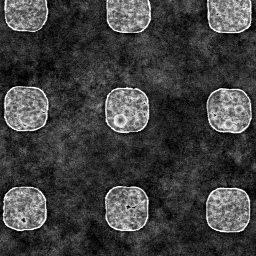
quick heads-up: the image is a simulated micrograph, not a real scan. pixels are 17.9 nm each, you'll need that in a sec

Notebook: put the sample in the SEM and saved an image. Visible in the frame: raised bodies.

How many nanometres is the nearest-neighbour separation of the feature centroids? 1780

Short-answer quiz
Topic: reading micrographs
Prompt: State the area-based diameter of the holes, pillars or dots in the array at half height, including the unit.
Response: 45.4 px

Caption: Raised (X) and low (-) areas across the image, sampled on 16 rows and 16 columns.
XXX----XX----XXX
-XX----XX----XX-
----------------
----------------
----------------
-X--------------
XXX----XX----XXX
XXX----XX----XXX
----------------
----------------
----------------
----------------
XXX----XX----XXX
XXX----XX----XXX
----------------
----------------